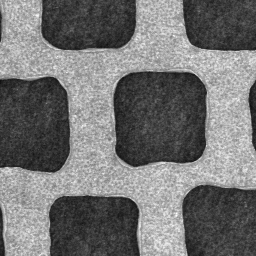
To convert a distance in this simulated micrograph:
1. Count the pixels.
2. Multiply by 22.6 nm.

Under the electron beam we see holes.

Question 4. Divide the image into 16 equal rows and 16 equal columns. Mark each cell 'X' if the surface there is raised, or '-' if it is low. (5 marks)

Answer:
XXX------XX-----
XXX------XXX----
XXX-----XXXX----
XXXXXXXXXXXXXXXX
XXXXXXXX----XXXX
----XXX------XXX
----XXX------XXX
----XXX------XXX
----XXX------XXX
----XXX------XXX
X---XXXXXXXXXXXX
XXXXXXXXXXXXXXXX
XXXX----XXXX----
XXX------XX-----
XXX------XXX----
XXX------XXX----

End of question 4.